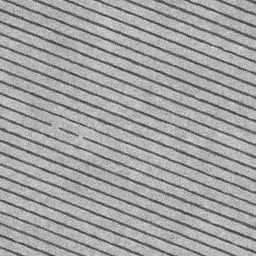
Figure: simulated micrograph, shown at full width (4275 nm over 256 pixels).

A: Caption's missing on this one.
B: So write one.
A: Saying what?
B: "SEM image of parallel lines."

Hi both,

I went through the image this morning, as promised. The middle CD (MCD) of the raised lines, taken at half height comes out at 144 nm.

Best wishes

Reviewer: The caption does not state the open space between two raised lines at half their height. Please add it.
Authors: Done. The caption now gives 0.0428 micrometres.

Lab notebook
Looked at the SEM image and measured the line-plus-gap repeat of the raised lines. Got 185 nm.